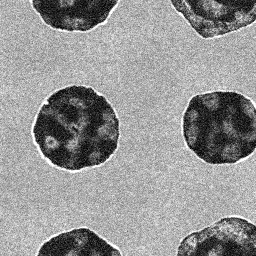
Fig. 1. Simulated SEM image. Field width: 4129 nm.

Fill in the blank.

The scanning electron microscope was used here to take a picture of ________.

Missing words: holes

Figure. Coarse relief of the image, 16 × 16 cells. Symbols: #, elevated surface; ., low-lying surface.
##.....####.....
###...######....
################
################
################
####..##########
###....#####....
##.....####.....
##.....####.....
###....#####....
####.###########
################
################
################
####..######....
###....####.....